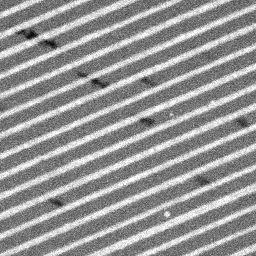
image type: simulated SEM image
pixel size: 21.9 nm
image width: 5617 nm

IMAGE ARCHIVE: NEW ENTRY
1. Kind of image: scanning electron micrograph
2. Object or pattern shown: parallel lines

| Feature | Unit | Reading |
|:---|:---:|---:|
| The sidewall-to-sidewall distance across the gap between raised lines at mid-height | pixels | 13.9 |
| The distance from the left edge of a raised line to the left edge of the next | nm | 404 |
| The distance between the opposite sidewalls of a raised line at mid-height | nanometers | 90.6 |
